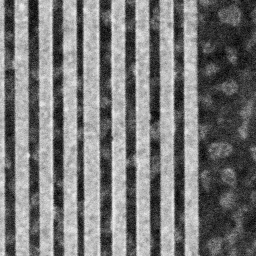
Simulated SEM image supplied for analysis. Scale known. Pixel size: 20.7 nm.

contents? parallel lines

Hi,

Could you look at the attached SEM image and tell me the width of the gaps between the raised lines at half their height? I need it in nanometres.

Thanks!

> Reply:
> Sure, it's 251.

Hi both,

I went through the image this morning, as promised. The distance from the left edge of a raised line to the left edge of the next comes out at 500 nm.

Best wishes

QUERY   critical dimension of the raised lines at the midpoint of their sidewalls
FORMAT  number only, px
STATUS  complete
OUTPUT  12.1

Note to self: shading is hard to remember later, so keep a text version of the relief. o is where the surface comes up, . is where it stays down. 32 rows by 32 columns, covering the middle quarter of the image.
ooo..ooo....ooo...ooo...ooo...oo
ooo..ooo....ooo...ooo...ooo...oo
ooo..ooo....ooo...ooo...ooo...oo
ooo..ooo....ooo...ooo...ooo...oo
ooo..ooo....ooo...ooo...ooo...oo
ooo..ooo....ooo...ooo...ooo...oo
ooo..ooo....ooo...ooo...ooo...oo
ooo..ooo....ooo...ooo...ooo...oo
ooo..ooo....ooo...ooo...ooo...oo
ooo..ooo....ooo...ooo...ooo...oo
ooo..ooo....ooo...ooo...ooo...oo
ooo..ooo....ooo...ooo...ooo...oo
ooo..ooo....ooo...ooo...ooo...oo
ooo..ooo....ooo...ooo...ooo...oo
ooo..oooo...ooo...ooo...ooo...oo
ooo..oooo...ooo...ooo...ooo...oo
ooo..oooo...ooo...ooo...ooo...oo
ooo..oooo...ooo...ooo...ooo...oo
ooo..oooo...ooo...ooo...ooo...oo
ooo..oooo...ooo...ooo...ooo...oo
ooo..oooo...ooo...ooo...ooo...oo
ooo..oooo...ooo...ooo...ooo...oo
ooo..oooo...ooo...ooo...ooo...oo
ooo..oooo...ooo...ooo...ooo...oo
ooo..oooo...ooo....oo...ooo...oo
ooo..oooo...ooo....oo...ooo...oo
ooo..oooo...ooo....oo...ooo...oo
ooo..oooo...ooo...ooo...ooo...oo
ooo..oooo...ooo...ooo...ooo...oo
ooo..oooo...ooo...ooo...ooo...oo
ooo..oooo...ooo...ooo...ooo...oo
ooo..oooo...ooo...ooo...ooo...oo